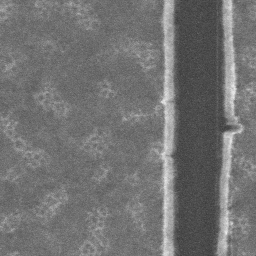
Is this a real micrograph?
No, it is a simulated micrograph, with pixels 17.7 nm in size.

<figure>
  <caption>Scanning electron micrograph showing one or a few lines or trenches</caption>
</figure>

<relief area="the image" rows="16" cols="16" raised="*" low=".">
***********...**
***********...**
***********...**
***********...**
***********...**
***********...**
***********...**
***********....*
***********...**
**********....**
**********....**
***********...**
***********...**
***********...**
***********...**
***********...**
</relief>